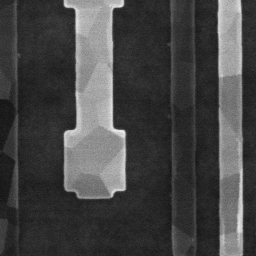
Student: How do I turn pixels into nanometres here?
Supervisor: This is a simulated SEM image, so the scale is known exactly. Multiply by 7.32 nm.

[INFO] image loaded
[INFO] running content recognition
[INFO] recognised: wiring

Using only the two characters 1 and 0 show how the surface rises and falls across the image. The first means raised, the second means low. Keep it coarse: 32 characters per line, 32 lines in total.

11000000111111100000011100011100
11000000011111000000011100011100
11000000001111000000011100011100
11000000001111000000011100011100
11000000001111000000011100011100
11000000001111000000011100011100
11000000001111000000011100011100
11000000001111000000001100011100
11000000001111000000001100011100
11000000001111000000011100011100
11000000001111000000011100011100
11000000001111000000011100011100
11000000001111000000011100011100
11000000001111000000011100011100
11000000001111000000001100011100
11000000001111000000001100001100
11000000111111100000001100001100
11000000111111110000001100001100
11000000111111110000001100001100
11000000111111110000001100001100
11000000111111110000001100001100
11000000111111110000001100001100
11000000111111110000001100001100
11000000111111110000001100001100
11000000001111000000001100001100
11000000000000000000001100001100
11000000000000000000001100001100
11000000000000000000001100001100
11000000000000000000001100001100
11000000000000000000001100001100
11000000000000000000001100001100
11000000000000000000001100001100